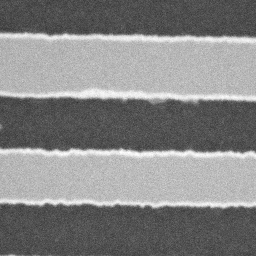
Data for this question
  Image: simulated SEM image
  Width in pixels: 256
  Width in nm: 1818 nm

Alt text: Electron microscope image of lines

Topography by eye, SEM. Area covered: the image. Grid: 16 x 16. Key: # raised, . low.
................
................
################
################
################
################
................
................
................
############....
################
################
################
................
................
................